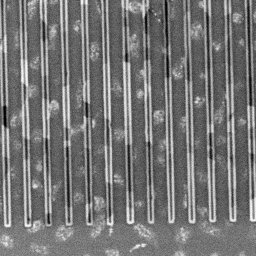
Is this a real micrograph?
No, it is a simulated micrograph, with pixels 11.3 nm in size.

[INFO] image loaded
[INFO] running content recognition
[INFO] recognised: parallel lines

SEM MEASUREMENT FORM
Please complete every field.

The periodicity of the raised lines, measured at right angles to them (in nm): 232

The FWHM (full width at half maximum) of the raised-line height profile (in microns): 0.0465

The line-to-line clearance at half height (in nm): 188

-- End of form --